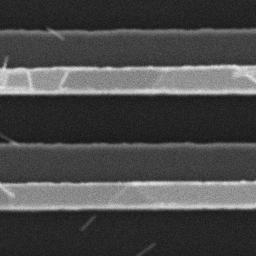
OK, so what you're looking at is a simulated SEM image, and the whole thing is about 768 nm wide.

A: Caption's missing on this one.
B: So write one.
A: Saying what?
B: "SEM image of lines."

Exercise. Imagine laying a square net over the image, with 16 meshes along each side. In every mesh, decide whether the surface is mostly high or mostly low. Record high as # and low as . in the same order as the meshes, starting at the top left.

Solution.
................
................
################
################
################
################
................
................
................
################
################
################
################
................
................
................